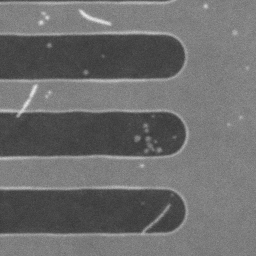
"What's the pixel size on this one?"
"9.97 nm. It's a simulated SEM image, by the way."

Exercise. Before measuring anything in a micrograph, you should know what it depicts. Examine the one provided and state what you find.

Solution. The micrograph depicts groups of lines, slits or small figures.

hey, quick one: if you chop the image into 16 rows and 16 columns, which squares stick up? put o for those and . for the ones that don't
oooooooooooooooo
oooooooooooooooo
...........ooooo
............oooo
...........ooooo
oooooooooooooooo
oooooooooooooooo
...........ooooo
............oooo
...........ooooo
oooooooooooooooo
oooooooooooooooo
...........ooooo
............oooo
...........ooooo
oooooooooooooooo